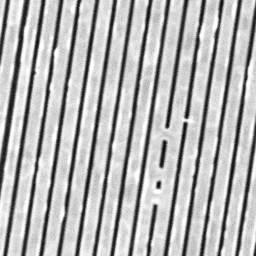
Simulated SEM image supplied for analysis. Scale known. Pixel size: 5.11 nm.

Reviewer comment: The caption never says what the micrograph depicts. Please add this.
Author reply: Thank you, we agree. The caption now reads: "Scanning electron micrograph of parallel lines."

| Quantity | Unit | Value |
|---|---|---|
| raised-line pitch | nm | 89.9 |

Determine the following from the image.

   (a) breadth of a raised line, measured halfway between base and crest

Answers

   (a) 60.7 nanometers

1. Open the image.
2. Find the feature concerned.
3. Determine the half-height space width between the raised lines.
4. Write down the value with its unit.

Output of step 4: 0.0259 µm